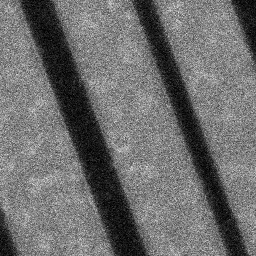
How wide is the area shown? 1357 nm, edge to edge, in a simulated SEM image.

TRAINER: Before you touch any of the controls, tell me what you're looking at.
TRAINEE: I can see one or a few lines or trenches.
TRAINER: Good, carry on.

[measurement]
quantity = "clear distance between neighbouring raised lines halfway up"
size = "382 nanometres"